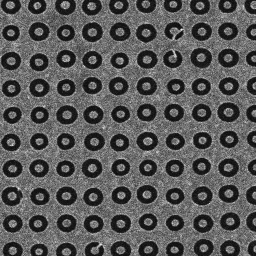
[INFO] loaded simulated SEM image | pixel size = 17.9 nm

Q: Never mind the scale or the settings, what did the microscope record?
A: a regular array of ring-shaped grooves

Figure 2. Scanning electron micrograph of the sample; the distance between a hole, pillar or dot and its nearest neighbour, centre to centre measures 0.47 microns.